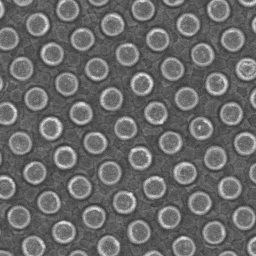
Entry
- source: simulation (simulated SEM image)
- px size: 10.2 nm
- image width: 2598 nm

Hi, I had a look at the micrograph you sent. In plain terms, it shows a regular array of raised bodies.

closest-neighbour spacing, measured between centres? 334 nanometres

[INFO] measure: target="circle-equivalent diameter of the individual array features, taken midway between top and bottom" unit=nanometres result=219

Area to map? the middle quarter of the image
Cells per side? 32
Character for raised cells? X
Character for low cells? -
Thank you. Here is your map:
------XXXXX-------------XXXXXX--
------XXXXX--------------XXXXX--
X-----XXXXX--------XX----XXXXX--
XXX----XXX-------XXXXX----XX----
XXX--------------XXXXX----------
XXX--------------XXXXX----------
XXX--------XX----XXXXX-------XXX
XX--------XXXX-----X--------XXXX
---------XXXXX--------------XXXX
---------XXXXX--------------XXXX
--XXXX----XXXX-------XXXX----XXX
--XXXXX-------------XXXXX-------
--XXXXX-------------XXXXXX------
--XXXXX--------X-----XXXX-------
---XXX-------XXXX----XXXX-------
-------------XXXXX--------------
-------------XXXXX--------------
------XXX----XXXXX-------XXX----
-----XXXXX----XX--------XXXXX---
-----XXXXX--------------XXXXX---
-----XXXXX--------------XXXXX---
XX----XXXX-------XXXX----XXXX---
XXX--------------XXXXX----------
XXX-------------XXXXXX----------
XXX--------------XXXXX----------
XX-------XXXXX---XXXX-------XXXX
---------XXXXX--------------XXXX
---------XXXXX--------------XXXX
--XXX----XXXXX-------XXX----XXXX
--XXXX----XXX-------XXXXX----XXX
-XXXXXX-------------XXXXX-------
-XXXXXX-------------XXXXX-------